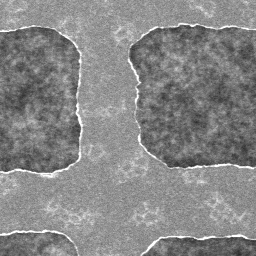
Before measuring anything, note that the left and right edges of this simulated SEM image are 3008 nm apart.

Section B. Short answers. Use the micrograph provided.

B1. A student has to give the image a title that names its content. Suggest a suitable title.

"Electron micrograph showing holes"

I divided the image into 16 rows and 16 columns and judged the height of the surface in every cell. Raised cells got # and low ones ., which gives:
################
################
....#####.......
.....###........
.....###........
.....####.......
.....####.......
.....####.......
.....####.......
.....####.......
....#######.####
################
################
################
#..#############
.....####.......